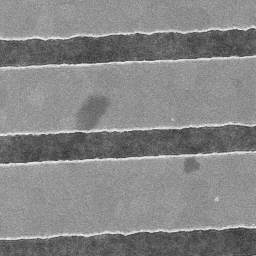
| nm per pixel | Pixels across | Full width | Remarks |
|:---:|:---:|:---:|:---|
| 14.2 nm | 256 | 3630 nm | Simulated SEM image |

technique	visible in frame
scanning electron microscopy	lines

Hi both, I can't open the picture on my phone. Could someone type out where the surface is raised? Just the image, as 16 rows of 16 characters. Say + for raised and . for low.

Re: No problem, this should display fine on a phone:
++++++++++++++++
++++++++++++++++
................
................
++++++++++++++++
++++++++++++++++
++++++++++++++++
++++++++++++++++
................
................
++++++++++++++++
++++++++++++++++
++++++++++++++++
++++++++++++++++
+++++++++.......
................